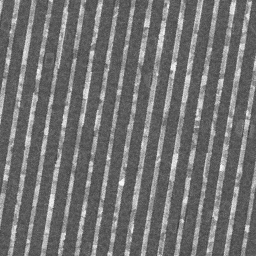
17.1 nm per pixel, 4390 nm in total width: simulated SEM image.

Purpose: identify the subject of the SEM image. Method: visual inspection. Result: parallel lines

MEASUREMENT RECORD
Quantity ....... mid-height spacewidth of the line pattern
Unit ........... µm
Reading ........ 0.214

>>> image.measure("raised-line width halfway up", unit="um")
0.0635